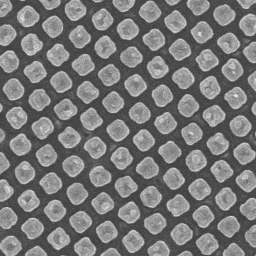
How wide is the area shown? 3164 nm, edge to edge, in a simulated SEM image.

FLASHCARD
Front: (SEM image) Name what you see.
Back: a regular array of raised bodies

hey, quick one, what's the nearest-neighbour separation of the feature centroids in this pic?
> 339 nanometres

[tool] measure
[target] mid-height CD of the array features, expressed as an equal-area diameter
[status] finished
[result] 247 nm